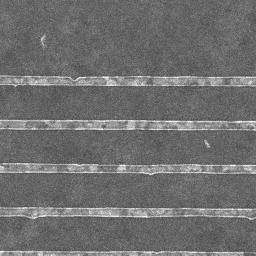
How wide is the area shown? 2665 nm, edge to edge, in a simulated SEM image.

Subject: parallel lines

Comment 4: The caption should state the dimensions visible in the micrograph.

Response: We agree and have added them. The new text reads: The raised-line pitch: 456 nm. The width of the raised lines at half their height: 84.6 nanometres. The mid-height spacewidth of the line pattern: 370 nm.